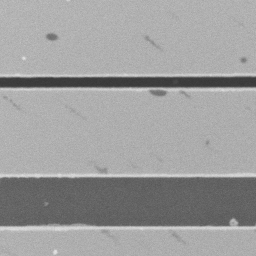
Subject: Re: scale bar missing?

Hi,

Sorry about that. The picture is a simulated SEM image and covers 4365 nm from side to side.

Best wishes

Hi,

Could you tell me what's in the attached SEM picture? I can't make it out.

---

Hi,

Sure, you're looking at lines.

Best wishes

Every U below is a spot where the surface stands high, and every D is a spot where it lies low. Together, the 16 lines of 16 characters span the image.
UUUUUUUUUUUUUUUU
UUUUUUUUUUUUUUUU
UUUUUUUUUUUUUUUU
UUUUUUUUUUUUUUUU
UUUUUUUUUUUUUUUU
UUUUUUUUUUUUUUUU
UUUUUUUUUUUUUUUU
UUUUUUUUUUUUUUUU
UUUUUUUUUUUUUUUU
UUUUUUUUUUUUUUUU
UUUUUUUUUUUUUUUU
DDDDDDDDDDDDDDDD
DDDDDDDDDDDDDDDD
DDDDDDDDDDDDDDDD
UUUUUUUUUUUUUUUU
UUUUUUUUUUUUUUUU